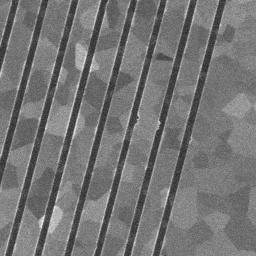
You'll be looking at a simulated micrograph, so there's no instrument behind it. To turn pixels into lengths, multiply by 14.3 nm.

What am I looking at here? parallel lines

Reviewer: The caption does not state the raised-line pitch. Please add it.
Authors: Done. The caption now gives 0.41 µm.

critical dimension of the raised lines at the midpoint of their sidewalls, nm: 308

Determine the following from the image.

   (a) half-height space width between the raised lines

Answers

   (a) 104 nm